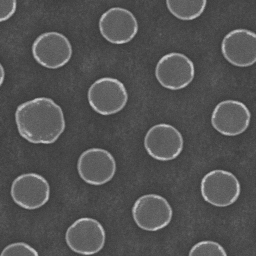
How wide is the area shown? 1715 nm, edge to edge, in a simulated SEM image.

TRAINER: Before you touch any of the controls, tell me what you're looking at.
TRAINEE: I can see a regular array of raised bodies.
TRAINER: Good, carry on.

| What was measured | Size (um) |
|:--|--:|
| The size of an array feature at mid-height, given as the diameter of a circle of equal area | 0.247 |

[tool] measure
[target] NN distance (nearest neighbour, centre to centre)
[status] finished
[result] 473 nm